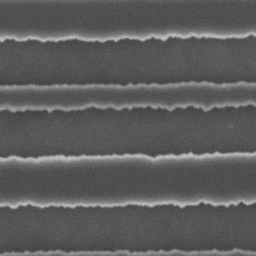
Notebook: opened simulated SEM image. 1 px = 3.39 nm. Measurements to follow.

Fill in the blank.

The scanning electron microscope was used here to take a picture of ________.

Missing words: lines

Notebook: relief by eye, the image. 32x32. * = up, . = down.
********************************
********************************
********************************
********************************
*******************************.
................................
................................
................................
................................
................................
.................*.*.***********
********************************
********************************
***********.*.*......*...*......
................................
................................
................................
................................
................................
.*....**..*.*******.************
********************************
********************************
********************************
********************************
********************************
*************************.***...
................................
................................
................................
................................
................................
...*****.*******..*****.********